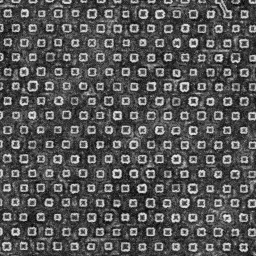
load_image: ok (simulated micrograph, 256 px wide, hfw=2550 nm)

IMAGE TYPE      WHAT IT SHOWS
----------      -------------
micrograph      a regular array of raised bodies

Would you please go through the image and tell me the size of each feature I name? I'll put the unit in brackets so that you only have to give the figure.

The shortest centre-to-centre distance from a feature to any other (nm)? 161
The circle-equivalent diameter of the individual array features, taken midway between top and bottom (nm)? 81.8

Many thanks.